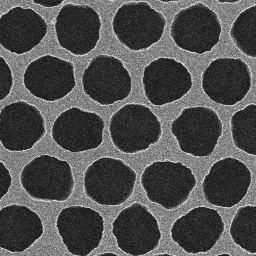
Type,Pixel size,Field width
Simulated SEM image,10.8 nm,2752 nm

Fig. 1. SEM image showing a regular array of holes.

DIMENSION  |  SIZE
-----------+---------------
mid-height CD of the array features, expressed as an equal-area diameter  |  515 nm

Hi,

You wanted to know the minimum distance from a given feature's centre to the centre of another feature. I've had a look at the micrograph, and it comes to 611 nanometers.